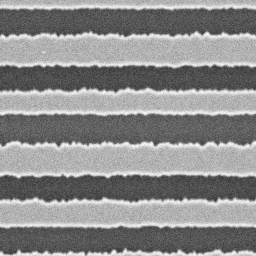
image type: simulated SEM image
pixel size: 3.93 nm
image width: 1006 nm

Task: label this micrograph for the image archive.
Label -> lines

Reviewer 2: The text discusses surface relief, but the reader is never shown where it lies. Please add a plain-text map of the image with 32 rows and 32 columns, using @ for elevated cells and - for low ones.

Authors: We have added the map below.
@@@@@@@@@@@@@@@@@@@@@@@@@@@@@@@@
--------------------------------
--------------------------------
--------------------------------
-@-@-@@--@@@@@@-@-@@@--@@@@@@@@@
@@@@@@@@@@@@@@@@@@@@@@@@@@@@@@@@
@@@@@@@@@@@@@@@@@@@@@@@@@@@@@@@@
@@@@@@@@@@@@@@@@@@@@@@@@@@@@@@@@
--------------------------------
--------------------------------
--------------------------------
@@@-@@@@-@@@@@-@@@@@@@@@@@@@@@@@
@@@@@@@@@@@@@@@@@@@@@@@@@@@@@@@@
@@@@@@@@@@@@@@@@@@@@@@@@@@@@@@@@
--------------------------------
--------------------------------
--------------------------------
--------------------------------
@@@@@@@@@@@@@@@@@@@@@@@@@@@@@@@@
@@@@@@@@@@@@@@@@@@@@@@@@@@@@@@@@
@@@@@@@@@@@@@@@@@@@@@@@@@@@@@@@@
@@@@@@@@@@@@@@@@@@@@@@@@@@@@@@@@
--------------------------------
--------------------------------
--------------------------------
@@@@@@@@@@@@@@@@@@@@@@@@@@@@@@@@
@@@@@@@@@@@@@@@@@@@@@@@@@@@@@@@@
@@@@@@@@@@@@@@@@@@@@@@@@@@@@@@@@
--------------------------------
--------------------------------
--------------------------------
-----------------@-@-------@--@-